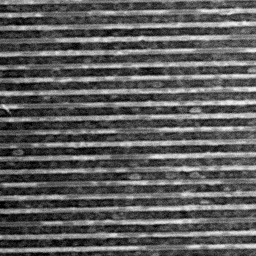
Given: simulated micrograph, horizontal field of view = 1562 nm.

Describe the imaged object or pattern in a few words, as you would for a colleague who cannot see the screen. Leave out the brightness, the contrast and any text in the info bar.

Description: parallel lines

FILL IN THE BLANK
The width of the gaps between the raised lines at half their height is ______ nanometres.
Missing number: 54.9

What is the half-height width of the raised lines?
25.1 nanometers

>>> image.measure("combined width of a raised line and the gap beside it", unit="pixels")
13.1